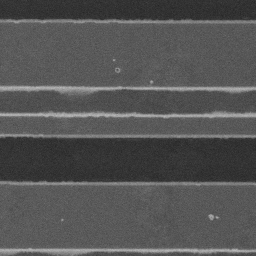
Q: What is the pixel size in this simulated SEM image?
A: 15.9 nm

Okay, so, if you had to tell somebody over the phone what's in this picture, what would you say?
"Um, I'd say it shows lines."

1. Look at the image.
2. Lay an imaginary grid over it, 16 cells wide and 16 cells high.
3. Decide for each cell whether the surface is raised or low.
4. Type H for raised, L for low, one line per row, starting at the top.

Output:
LLLLLLLLLLLLLLLL
HHHHHHHHHHHHHHHH
HHHHHHHHHHHHHHHH
HHHHHHHHHHHHHHHH
HHHHHHHHHHHHHHHH
HHHHHHHHHHHHHHHH
HHHHHHHHHHHHHHHH
HHHHHHHHHHHHHHHH
LLLLLHHHHHHHHHHH
LLLLLLLLLLLLLLLL
LLLLLLLLLLLLLLLL
HHHHHHHHHLHHLHHH
HHHHHHHHHHHHHHHH
HHHHHHHHHHHHHHHH
HHHHHHHHHHHHHHHH
HHHHHHHHHHHHHHHH